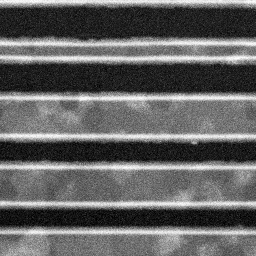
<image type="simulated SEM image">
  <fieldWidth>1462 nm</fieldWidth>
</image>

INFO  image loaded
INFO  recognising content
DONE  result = one or a few lines or trenches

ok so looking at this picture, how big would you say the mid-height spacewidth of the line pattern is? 202 nanometres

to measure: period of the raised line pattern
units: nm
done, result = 385